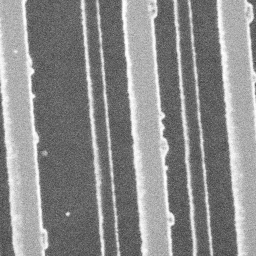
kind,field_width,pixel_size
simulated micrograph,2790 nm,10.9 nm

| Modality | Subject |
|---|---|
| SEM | lines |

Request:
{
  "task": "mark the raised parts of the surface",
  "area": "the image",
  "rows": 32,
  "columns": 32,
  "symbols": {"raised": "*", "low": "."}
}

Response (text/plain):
***.......**...*****..**...****.
***.......**...*****..**...*****
***.......**...****...**...****.
***.......***..****...**...****.
***........**...***...**....***.
***........**...***...**....***.
***........**...***...**....***.
****.......**...***...**....***.
****.......**...****..**....***.
****.......**...****...**...****
****.......**...****...**...****
****.......**...****...**...****
****.......**...****...**...****
****.......**...****...**...****
.***.......**....***...**....***
.***........*....***...**....***
.***........**...***...**....***
.****.......**...****..**....***
.****.......**...****..**....***
.****.......**...****..**....***
.****.......**...****..***...***
.****.......**...****..***...***
.****.......**...****...**...***
.****.......**...****...**...***
.****.......**...****...**...***
..***.......**....***...**....**
..***........*....***...**....**
..***........**...****..**....**
..***........**...***...**....**
..****.......**...***...**....**
..****.......**...***...**....**
..****.......**...***...**....**